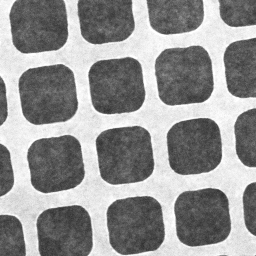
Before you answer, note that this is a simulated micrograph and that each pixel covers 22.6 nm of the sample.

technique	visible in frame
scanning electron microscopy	holes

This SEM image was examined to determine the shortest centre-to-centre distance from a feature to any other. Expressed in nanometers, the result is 1580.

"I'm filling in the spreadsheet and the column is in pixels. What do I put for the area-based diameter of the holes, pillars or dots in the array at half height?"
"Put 60.6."